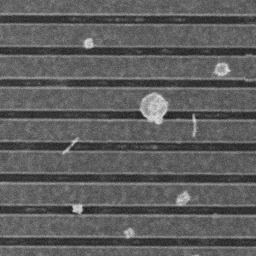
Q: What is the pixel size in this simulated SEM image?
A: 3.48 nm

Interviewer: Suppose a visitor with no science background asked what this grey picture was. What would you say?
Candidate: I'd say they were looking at parallel lines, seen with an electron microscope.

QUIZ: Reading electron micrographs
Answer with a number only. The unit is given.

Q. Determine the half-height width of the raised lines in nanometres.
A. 80.1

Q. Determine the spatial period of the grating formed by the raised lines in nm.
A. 111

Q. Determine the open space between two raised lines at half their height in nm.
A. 30.9